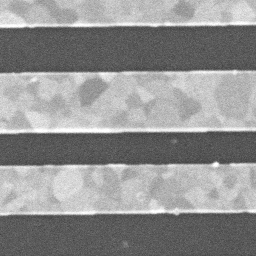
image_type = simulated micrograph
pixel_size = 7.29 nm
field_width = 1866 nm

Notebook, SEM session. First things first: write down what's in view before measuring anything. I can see lines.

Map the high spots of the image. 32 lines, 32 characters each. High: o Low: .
oooooooooooooooooooooooooooooooo
oooooooooooooooooooooooooooooooo
oooooooooooooooooooooooooooooooo
................................
................................
................................
................................
................................
................................
oooooooooooooooooooooooooooooooo
oooooooooooooooooooooooooooooooo
oooooooooooooooooooooooooooooooo
oooooooooooooooooooooooooooooooo
oooooooooooooooooooooooooooooooo
oooooooooooooooooooooooooooooooo
oooooooooooooooooooooooooooooooo
oooooooo........................
................................
................................
................................
................................
oooooooooooooooooooooooooooooooo
oooooooooooooooooooooooooooooooo
oooooooooooooooooooooooooooooooo
oooooooooooooooooooooooooooooooo
oooooooooooooooooooooooooooooooo
oooooooooooooooooooooooooooooo..
................................
................................
................................
................................
................................